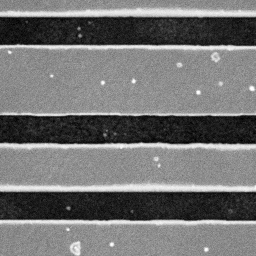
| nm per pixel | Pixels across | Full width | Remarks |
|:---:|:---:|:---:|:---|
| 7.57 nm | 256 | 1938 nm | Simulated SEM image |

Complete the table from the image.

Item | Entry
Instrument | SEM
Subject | lines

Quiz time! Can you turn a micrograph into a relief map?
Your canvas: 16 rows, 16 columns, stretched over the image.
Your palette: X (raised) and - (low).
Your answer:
XXXXXXXXXXXXXXXX
----------------
----------------
XXXXXXXXXXXXXXXX
XXXXXXXXXXXXXXXX
XXXXXXXXXXXXXXXX
XXXXXXXXXXXXXXXX
----------------
----------------
XXXXXXXXXXXXXXXX
XXXXXXXXXXXXXXXX
XXXXXXXXXXXXXXXX
----------------
----------------
XXXXXXXXXXXXXXXX
XXXXXXXXXXXXXXXX